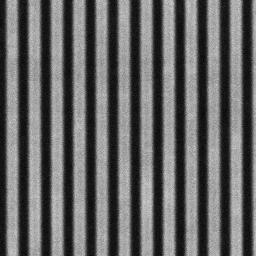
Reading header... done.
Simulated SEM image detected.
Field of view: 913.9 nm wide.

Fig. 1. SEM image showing parallel lines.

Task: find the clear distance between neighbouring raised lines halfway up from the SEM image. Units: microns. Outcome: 0.0392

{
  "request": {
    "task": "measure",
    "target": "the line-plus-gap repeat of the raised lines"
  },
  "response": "0.0799 um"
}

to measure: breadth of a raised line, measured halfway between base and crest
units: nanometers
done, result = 38.8